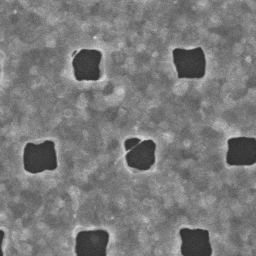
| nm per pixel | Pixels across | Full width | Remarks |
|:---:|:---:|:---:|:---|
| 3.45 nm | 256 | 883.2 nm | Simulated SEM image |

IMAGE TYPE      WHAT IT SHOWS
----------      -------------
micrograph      holes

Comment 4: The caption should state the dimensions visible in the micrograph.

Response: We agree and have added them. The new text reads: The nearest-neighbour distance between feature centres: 349 nanometres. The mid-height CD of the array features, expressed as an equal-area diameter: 118 nm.